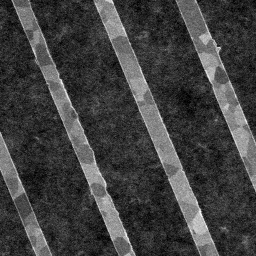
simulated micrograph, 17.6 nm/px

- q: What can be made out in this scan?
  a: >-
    one or a few lines or trenches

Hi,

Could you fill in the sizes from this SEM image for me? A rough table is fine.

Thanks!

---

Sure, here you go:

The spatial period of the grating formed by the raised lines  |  76.5 px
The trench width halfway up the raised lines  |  1.06 um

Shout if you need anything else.